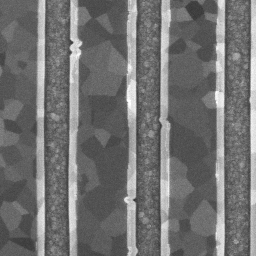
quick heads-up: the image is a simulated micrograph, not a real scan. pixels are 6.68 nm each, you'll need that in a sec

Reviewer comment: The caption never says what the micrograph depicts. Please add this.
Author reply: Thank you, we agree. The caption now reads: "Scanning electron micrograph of one or a few lines or trenches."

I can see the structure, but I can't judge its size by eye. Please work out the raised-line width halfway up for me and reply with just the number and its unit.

385 nm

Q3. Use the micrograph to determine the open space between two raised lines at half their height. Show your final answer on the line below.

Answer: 212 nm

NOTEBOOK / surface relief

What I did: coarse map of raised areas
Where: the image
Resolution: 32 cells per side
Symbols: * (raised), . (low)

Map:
*****....********....*******....
*****....********....*******....
*****....********....*******....
*****....********....*******....
*****....********....*******....
*****....********....*******....
*****....********....*******....
*****....********....*******....
*****....********....*******....
*****....********....*******....
*****....********....*******....
*****....********....*******....
*****....********....*******....
*****....********....*******....
*****....********...********....
*****....********....*******....
*****....********...********....
*****....********...********....
*****....********...********....
*****....********...********....
*****....********...********....
*****....********...********....
*****....********...********....
*****....********...********....
*****....********...********....
*****....*******.....*******....
*****....*******.....*******....
*****....*******.....*******....
*****....********....*******....
*****....********....*******....
*****....********....*******....
*****....********....*******....